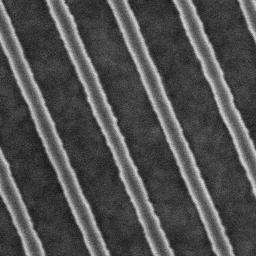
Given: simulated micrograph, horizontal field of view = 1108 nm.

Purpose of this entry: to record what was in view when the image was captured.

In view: lines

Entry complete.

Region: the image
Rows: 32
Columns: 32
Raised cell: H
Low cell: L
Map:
LLLLLLHHLLLLLLHHLLLLLLHHLLLLLLHH
HLLLLLHHHLLLLLHHLLLLLLHHLLLLLLHH
HLLLLLLHHLLLLLLHHLLLLLLHHLLLLLLH
HHLLLLLHHHLLLLLHHLLLLLLHHLLLLLLH
HHLLLLLLHHLLLLLHHHLLLLLHHHLLLLLL
HHLLLLLLHHLLLLLLHHLLLLLLHHLLLLLL
LHHLLLLLLHHLLLLLHHLLLLLLHHHLLLLL
LHHLLLLLLHHLLLLLLHHLLLLLLHHLLLLL
LHHHLLLLLHHHLLLLLHHLLLLLLHHHLLLL
LLHHLLLLLLHHLLLLLLHHLLLLLLHHLLLL
LLHHLLLLLLHHLLLLLLHHLLLLLLHHLLLL
LLLHHLLLLLLHHLLLLLHHHLLLLLLHHLLL
LLLHHLLLLLLHHLLLLLLHHLLLLLLHHLLL
LLLLHHLLLLLLHHLLLLLHHLLLLLLHHLLL
LLLLHHLLLLLLHHLLLLLLHHLLLLLLHHLL
LLLLHHHLLLLLHHHLLLLLHHLLLLLLHHLL
LLLLLHHLLLLLLHHLLLLLLHHLLLLLLHHL
LLLLLHHLLLLLLHHLLLLLLHHLLLLLLHHL
LLLLLLHHLLLLLLHHLLLLLHHHLLLLLLHH
LLLLLLHHLLLLLLHHLLLLLLHHLLLLLLHH
HLLLLLLHHLLLLLLHHLLLLLHHLLLLLLHH
HLLLLLLHHLLLLLLHHLLLLLLHHLLLLLLH
HHLLLLLHHHLLLLLHHHLLLLLHHLLLLLLH
HHLLLLLLHHLLLLLLHHLLLLLHHHLLLLLL
HHHLLLLLHHLLLLLLHHLLLLLLHHLLLLLL
LHHLLLLLLHHLLLLLLHHLLLLLHHHLLLLL
LHHLLLLLLHHLLLLLLHHLLLLLLHHLLLLL
LLHHLLLLLHHHLLLLLHHHLLLLLHHLLLLL
LLHHLLLLLLHHLLLLLLHHLLLLLLHHLLLL
LLLHHLLLLLHHHLLLLLHHHLLLLLHHLLLL
LLLHHLLLLLLHHLLLLLLHHLLLLLHHHLLL
LLLHHLLLLLLHHLLLLLLHHHLLLLLHHLLL